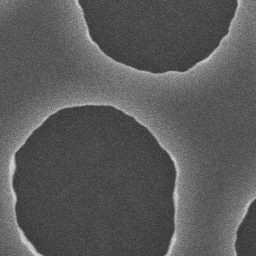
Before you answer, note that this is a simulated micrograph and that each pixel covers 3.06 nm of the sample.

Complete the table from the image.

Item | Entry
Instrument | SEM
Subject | holes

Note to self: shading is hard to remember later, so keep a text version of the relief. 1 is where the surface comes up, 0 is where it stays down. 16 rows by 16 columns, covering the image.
1111100000000001
1111100000000011
1111110000000011
1111111000000111
1111111110011111
1111111111111111
1111111111111111
1110000011111111
1100000000111111
1000000000111111
1000000000011111
1000000000011111
1000000000011111
1000000000011110
1000000000011110
1100000000011110